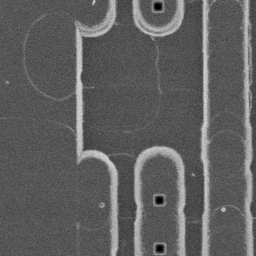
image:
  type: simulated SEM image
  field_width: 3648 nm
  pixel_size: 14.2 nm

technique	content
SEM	wiring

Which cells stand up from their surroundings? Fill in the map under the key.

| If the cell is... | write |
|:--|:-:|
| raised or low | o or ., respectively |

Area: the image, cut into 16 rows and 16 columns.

ooooooo.ooo..oo.
ooooooo..oo..oo.
ooooo........oo.
ooooo........oo.
ooooo........oo.
ooooo........oo.
ooooo........oo.
ooooo........oo.
ooooo........ooo
ooooo........ooo
ooooooo..oo..ooo
ooooooo..oo..ooo
ooooooo..oo..ooo
ooooooo..oo..ooo
ooooooo..oo..ooo
ooooooo..oo..ooo